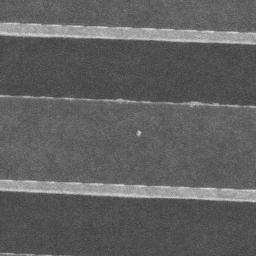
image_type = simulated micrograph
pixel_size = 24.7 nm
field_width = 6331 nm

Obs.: lines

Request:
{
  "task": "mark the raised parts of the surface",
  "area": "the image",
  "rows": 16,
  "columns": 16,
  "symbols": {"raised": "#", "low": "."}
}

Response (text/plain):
################
################
..........######
................
................
................
##############..
################
################
################
################
################
..............##
................
................
................